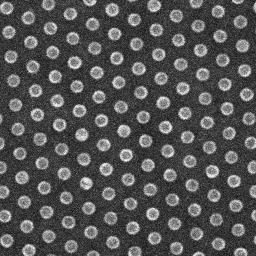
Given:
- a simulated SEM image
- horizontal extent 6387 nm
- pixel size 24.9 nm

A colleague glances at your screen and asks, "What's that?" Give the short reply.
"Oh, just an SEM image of a regular array of raised bodies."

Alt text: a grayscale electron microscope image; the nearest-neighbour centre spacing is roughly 601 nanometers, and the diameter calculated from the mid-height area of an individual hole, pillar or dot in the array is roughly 297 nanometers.